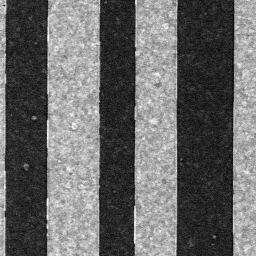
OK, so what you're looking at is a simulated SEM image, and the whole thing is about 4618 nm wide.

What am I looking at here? one or a few lines or trenches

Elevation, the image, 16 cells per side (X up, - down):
---XXX---XX----X
---XXX---XX----X
---XXX---XX----X
---XXX---XX----X
---XXX---XX----X
---XXX---XX----X
---XXX---XX----X
---XXX--XXX----X
---XXX--XXX----X
---XXX--XXX----X
---XXX--XXX----X
---XXX--XXX----X
---XXX--XXX----X
---XXX--XXX----X
---XXX--XXX----X
---XXX--XXX----X